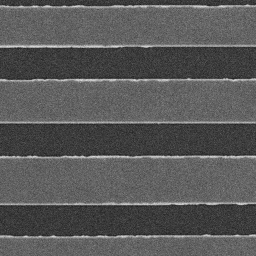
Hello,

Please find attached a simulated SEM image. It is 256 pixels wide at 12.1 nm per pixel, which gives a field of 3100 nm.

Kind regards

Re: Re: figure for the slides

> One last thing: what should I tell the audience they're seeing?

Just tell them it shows lines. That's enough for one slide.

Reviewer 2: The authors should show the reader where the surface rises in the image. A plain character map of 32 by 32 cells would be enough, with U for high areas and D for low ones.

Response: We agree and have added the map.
DDDDDDDDDDDDDDDDDDDDDDDDDDDDDDDD
UUUUUUUUUUUUUUUUUUUUUUUUUUUUUUUU
UUUUUUUUUUUUUUUUUUUUUUUUUUUUUUUU
UUUUUUUUUUUUUUUUUUUUUUUUUUUUUUUU
UUUUUUUUUUUUUUUUUUUUUUUUUUUUUUUU
UUUUUUUUUUUUUUUUUUUUUUUUUUUUUUUU
DDDDDDDDDDDDDDDDDDDDDDDDDDDDDDDD
DDDDDDDDDDDDDDDDDDDDDDDDDDDDDDDD
DDDDDDDDDDDDDDDDDDDDDDDDDDDDDDDD
DDDDDDDDDDDDDDDDDDDDDDDDDDDDDDDD
UUUUUUUUUUUUUUUUUUUUUUUUUUUUUUUU
UUUUUUUUUUUUUUUUUUUUUUUUUUUUUUUU
UUUUUUUUUUUUUUUUUUUUUUUUUUUUUUUU
UUUUUUUUUUUUUUUUUUUUUUUUUUUUUUUU
UUUUUUUUUUUUUUUUUUUUUUUUUUUUUUUU
DDDDDDDDDDDDDDDDDDDDDDDDDDDDDDDD
DDDDDDDDDDDDDDDDDDDDDDDDDDDDDDDD
DDDDDDDDDDDDDDDDDDDDDDDDDDDDDDDD
DDDDDDDDDDDDDDDDDDDDDDDDDDDDDDDD
DDDDDDDDDDDDDDDDDDDDDDDDDDDDDDDD
UUUUUUUUUUUUUUUUUUUUUUUUUUUUUUUU
UUUUUUUUUUUUUUUUUUUUUUUUUUUUUUUU
UUUUUUUUUUUUUUUUUUUUUUUUUUUUUUUU
UUUUUUUUUUUUUUUUUUUUUUUUUUUUUUUU
UUUUUUUUUUUUUUUUUUUUUUUUUUUUUUUU
UUUUUUUUUUUUUUUUUUUUUUUUUUUUDUUD
DDDDDDDDDDDDDDDDDDDDDDDDDDDDDDDD
DDDDDDDDDDDDDDDDDDDDDDDDDDDDDDDD
DDDDDDDDDDDDDDDDDDDDDDDDDDDDDDDD
DDDDDDDDDDDDDDDDDDDDDDDDDUDDDUDU
UUUUUUUUUUUUUUUUUUUUUUUUUUUUUUUU
UUUUUUUUUUUUUUUUUUUUUUUUUUUUUUUU